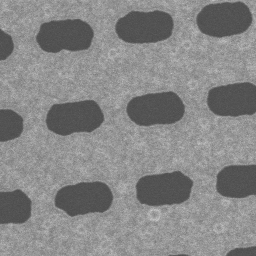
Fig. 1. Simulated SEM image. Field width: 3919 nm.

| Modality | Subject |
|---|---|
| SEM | holes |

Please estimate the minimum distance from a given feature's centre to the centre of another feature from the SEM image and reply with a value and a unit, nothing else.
1230 nm